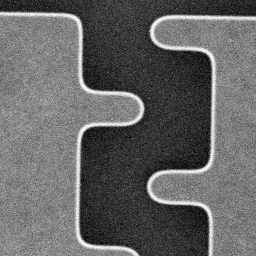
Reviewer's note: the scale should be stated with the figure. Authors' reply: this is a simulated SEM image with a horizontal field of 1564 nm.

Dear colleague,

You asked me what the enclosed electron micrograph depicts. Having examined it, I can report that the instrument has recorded groups of lines, slits or small figures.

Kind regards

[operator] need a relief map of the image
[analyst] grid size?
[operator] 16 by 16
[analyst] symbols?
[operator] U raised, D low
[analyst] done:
DDDDDDDDDDDDDDDD
UUUUUDDDDDUUUUUU
UUUUUDDDDDUUUUUU
UUUUUDDDDDDDDUUU
UUUUUDDDDDDDDUUU
UUUUUUDDDDDDDUUU
UUUUUUUUUDDDDUUU
UUUUUUUUUDDDDUUU
UUUUUDDDDDDDDUUU
UUUUUDDDDDDDDUUU
UUUUUDDDDDDDDUUU
UUUUUDDDDUUUUUUU
UUUUUDDDDDUUUUUU
UUUUUDDDDDDDDUUU
UUUUUDDDDDDDDUUU
UUUUUUUUDDDDDUUU